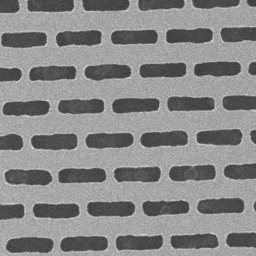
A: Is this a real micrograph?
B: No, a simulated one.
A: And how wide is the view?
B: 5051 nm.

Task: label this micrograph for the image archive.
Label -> a regular array of holes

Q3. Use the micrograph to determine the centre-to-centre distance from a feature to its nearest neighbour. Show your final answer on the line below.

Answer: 856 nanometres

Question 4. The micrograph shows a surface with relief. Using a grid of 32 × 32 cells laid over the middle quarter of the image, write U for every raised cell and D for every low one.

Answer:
UUUUUUDDDDDDDDDDUUUDDDDDDDDDDDDU
DDDUUDDDDDDDDDDDDUUDDDDDDDDDDDDU
DDDUUDDDDDDDDDDDDUUDDDDDDDDDDDUU
DDDUUUDDDDDDDDDDUUUUDUDUUUDUUUUU
UUUUUUUUUUUUUUUUUUUUUUUUUUUUUUUU
UUUUUUUUUUUUUUUUUUUUUUUUUUUUUUUU
UUUUUUUUUUUUUUUUUUUUUUUUUUUUUUUU
UUUUUUUUUUUUUUUUUUUUUUUUUUUUUUUU
UUUUUUUDUUUUUUUUDDDUDDDUUUDDDDDD
DDDDDDDDDDUUDDDDDDDDDDDDUUDDDDDD
DDDDDDDDDDUUDDDDDDDDDDDDUUDDDDDD
DDDDDDDDDDUUDDDDDDDDDDDUUUDDDDDD
UUDDDDDDUUUUUUDUUUUUUUUUUUUUUUUU
UUUUUUUUUUUUUUUUUUUUUUUUUUUUUUUU
UUUUUUUUUUUUUUUUUUUUUUUUUUUUUUUU
UUUUUUUUUUUUUUUUUUUUUUUUUUUUUUUU
UUUUUUUUUUUUUUUUUUUUUUUUUUUUDUUU
DDDUUUDDDDDDDDDDDUUUDDDDDDDDDDDU
DDDUUUDDDDDDDDDDDDUDDDDDDDDDDDDU
DDDUUDDDDDDDDDDDDUUDDDDDDDDDDDDU
DDDUUUDDDDDDDDDDDUUUDDDDDDDDDUUU
UUUUUUUUUUUUUUUUUUUUUUUUUUUUUUUU
UUUUUUUUUUUUUUUUUUUUUUUUUUUUUUUU
UUUUUUUUUUUUUUUUUUUUUUUUUUUUUUUU
UUUUUUUUUUUUUUUUUUUUUUUUUUUUUUUU
UUUUUUUUUUUUUUUUUUUUUUUUUUUUUDDD
DDDDDDDDDDUUUDDDDDDDDDDDUUDDDDDD
DDDDDDDDDDUUDDDDDDDDDDDDUUDDDDDD
DDDDDDDDDDDUUDDDDDDDDDDDUUDDDDDD
DDDDDDDDDDUUUUUUUDDDDDDUUUUUDDUU
UUUUUUUUUUUUUUUUUUUUUUUUUUUUUUUU
UUUUUUUUUUUUUUUUUUUUUUUUUUUUUUUU